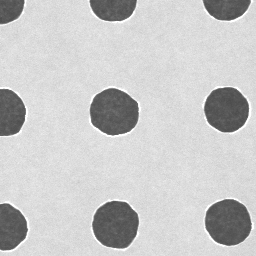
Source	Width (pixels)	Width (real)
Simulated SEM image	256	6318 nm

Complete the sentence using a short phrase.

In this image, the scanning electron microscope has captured holes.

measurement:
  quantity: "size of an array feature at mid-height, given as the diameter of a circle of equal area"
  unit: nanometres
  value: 1170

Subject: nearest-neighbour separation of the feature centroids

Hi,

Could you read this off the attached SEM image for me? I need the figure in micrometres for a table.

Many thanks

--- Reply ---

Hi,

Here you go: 2.78